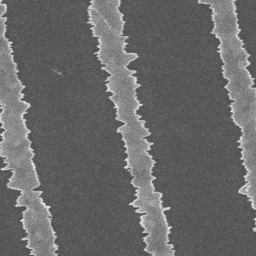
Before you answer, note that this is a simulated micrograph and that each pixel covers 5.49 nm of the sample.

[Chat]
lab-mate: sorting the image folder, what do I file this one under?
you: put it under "one or a few lines or trenches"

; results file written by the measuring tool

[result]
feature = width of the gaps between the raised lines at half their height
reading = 487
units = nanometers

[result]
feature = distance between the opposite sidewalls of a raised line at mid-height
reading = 138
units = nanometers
